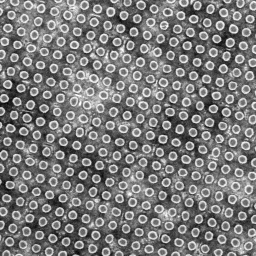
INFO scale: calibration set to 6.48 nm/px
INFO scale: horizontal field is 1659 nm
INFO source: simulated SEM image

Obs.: a regular array of raised bodies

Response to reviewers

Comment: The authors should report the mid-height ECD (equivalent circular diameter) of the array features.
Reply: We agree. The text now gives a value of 53.2 nm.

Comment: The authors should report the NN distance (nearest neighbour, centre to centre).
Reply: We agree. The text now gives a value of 87 nm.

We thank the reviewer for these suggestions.